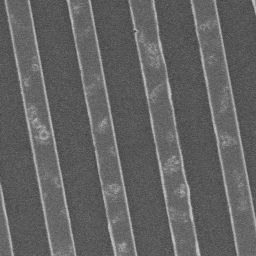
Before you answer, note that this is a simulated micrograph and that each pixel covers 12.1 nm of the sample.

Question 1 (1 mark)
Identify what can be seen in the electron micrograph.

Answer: one or a few lines or trenches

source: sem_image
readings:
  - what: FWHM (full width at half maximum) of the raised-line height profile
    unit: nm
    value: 276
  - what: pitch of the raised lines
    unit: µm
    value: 0.74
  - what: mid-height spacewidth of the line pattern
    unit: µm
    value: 0.466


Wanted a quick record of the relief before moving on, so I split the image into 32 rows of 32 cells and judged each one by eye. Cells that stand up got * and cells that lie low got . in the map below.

.***.....**.....***.....***.....
.***.....**.....***.....***.....
.***.....***.....***....***.....
.***.....***.....***....***.....
.***.....***.....***.....***....
..***....***.....***.....***....
..***.....**.....***.....***....
..***.....***....****....***....
..***.....***.....***....***....
..***.....***.....***.....***...
...***....***.....***.....***...
...***.....**.....***.....***...
...***.....***....***.....***...
...***.....***.....***....***...
...***.....***.....***.....***..
....**.....***.....***.....***..
....***....***.....***.....***..
....***.....**.....***.....***..
....***.....***.....**.....***..
....***.....***.....***....***..
....***.....***.....***.....***.
.....***....***.....***.....***.
.....***.....**.....***.....***.
.....***.....***....****....***.
.....***.....***.....***....***.
.....***.....***.....***.....***
*.....**.....***.....***.....***
*.....***....***.....***.....***
*.....***.....**.....***.....***
*.....***.....***.....***....***
*.....***.....***.....***....***
**....***.....***.....***.....**